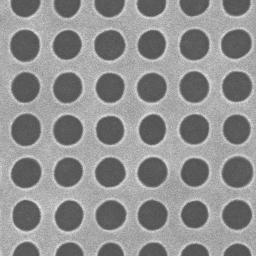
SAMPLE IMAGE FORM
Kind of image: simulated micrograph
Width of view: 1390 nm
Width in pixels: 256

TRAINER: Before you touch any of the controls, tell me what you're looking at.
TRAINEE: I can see a regular array of holes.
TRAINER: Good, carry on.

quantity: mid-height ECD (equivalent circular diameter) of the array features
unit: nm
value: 162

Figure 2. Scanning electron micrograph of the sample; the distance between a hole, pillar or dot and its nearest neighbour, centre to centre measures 0.228 microns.